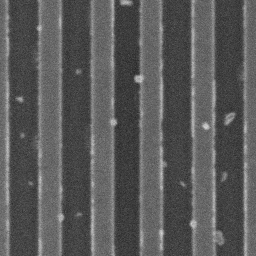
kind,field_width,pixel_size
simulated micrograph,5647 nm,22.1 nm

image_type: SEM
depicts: lines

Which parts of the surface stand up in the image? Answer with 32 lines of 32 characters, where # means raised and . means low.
#....###....##....##....###....#
#....###....##....##....###....#
#....###....##....##....###....#
#....###....##....##....###....#
#....###....##....##....###....#
#....###....##....##....###....#
#....###....##....##....###....#
#....###....##....##....###....#
#....###....##....##....###....#
#....###....##...###....###....#
#....###....##...###....###....#
#....###....##....##....###....#
#....###....##....##....###....#
#....###....##....##....###....#
#....###....##....##....###....#
#....###....##....##....###....#
#....###....##....##....###....#
#....###....##....##....###....#
#....###....##....##....###....#
#....###....##....##....###....#
#....###....##....##....###....#
#....###....##....##....###....#
#....###....##....##....###....#
#....###....##....##....###....#
#....###....##....##....###....#
#....###....##....##....###....#
#....###....##....##....###....#
#....###....##....##....###....#
#....###....##....##....###....#
#....###....##....##....###....#
#....###....##....##....###....#
#....###....##....##....###....#